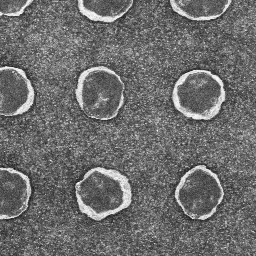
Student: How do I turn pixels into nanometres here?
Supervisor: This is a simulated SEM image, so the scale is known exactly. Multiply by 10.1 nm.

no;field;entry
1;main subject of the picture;raised bodies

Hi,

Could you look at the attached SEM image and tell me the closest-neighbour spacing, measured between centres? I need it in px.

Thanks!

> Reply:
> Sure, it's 98.2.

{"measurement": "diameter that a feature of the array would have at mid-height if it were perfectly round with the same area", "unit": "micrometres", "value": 0.485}